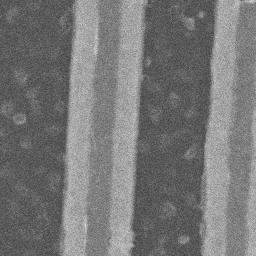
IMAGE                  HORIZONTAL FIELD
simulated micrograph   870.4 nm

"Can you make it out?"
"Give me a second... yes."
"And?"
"one or a few lines or trenches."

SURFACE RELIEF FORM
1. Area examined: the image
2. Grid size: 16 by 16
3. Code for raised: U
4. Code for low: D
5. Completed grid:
DDDDDUUUDDDDDDUU
DDDDDUUUDDDDDDUU
DDDDDUUUDDDDDDUU
DDDDDUUUDDDDDDUU
DDDDDUUUDDDDDDUU
DDDDDUUUDDDDDDUU
DDDDDUUUDDDDDDUU
DDDDDUUUDDDDDDUU
DDDDDUUUDDDDDDUU
DDDDDUUUDDDDDUUU
DDDDDUUUDDDDDUUU
DDDDDUUUDDDDDUUU
DDDDDUUUDDDDDUUU
DDDDUUUUDDDDDUUU
DDDDDUUUDDDDDUUU
DDDDUUUUDDDDDUUU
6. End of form